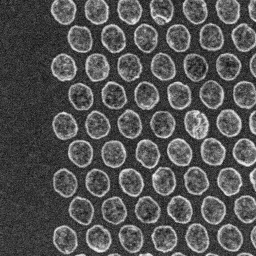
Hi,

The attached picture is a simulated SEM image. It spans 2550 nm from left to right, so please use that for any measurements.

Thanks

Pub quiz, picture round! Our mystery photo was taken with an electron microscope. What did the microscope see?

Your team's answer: a regular array of raised bodies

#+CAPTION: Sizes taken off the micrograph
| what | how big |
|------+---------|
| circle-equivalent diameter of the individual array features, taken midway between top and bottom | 251 nanometers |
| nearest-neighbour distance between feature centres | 0.321 micrometres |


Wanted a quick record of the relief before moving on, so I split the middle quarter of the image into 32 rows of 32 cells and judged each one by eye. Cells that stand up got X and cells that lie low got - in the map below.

XXX---XXXXX---XXXXX---XXXXX---XX
XXX---XXXXX---XXXXX---XXXXXX--XX
XXX---XXXXX---XXXXX----XXXXX---X
XX-----XXX-----XXX------XXX----X
--------------------------------
--XXX-----XXXX-----XXXX---XXXX--
-XXXXXX---XXXXX---XXXXX---XXXXX-
-XXXXXX---XXXXX---XXXXXX--XXXXXX
-XXXXXX---XXXXXX--XXXXXX--XXXXXX
--XXXXX---XXXXXX--XXXXX---XXXXXX
---XXXX----XXXX----XXX-----XXXX-
--------------------------------
X------XX------XXX-----XXX-----X
XX----XXXXX---XXXXX---XXXXX---XX
XXX---XXXXX--XXXXXX---XXXXXX--XX
XXX--XXXXXX---XXXXX---XXXXXX--XX
XXX---XXXXX---XXX-X---XXXXX----X
XXX---XXXXX----XXXX----XXXX----X
X------XX-----------------------
--XXXX-----XXX-----XXX-----XXX--
-XXXXXX---XXXXX----XXXX---XXXXX-
-XXXXXX---XXXXX---XXXXX---XXXXXX
-XXXXXX---XXXXX---XXXXXX--XXXXXX
--XXXXX---XXXXX---XXXXXX---XXXXX
--XXXX----XXXXX----XXXX----XXXX-
----X------XXX------XXX---------
X-------X------XX------XXXX----X
XX----XXXX----XXXXX----XXXX---XX
XXX---XXXXX---XXXXX---XXXXXX--XX
XXX---XXXXX---XXXXXX--XXXXXX--XX
XXX---XXXXX---XXXXXX--XXXXXX--XX
XXX---XXXXX----XXXX----XXXX----X